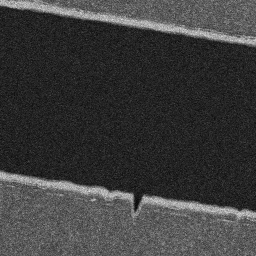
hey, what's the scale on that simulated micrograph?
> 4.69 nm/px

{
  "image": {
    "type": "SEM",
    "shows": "one or a few lines or trenches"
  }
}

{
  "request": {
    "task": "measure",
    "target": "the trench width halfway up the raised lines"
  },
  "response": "809 nanometers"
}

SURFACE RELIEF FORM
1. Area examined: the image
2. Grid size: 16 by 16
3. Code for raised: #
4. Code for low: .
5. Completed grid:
...#############
.........#######
...............#
................
................
................
................
................
................
................
................
###.............
########........
################
################
################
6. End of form